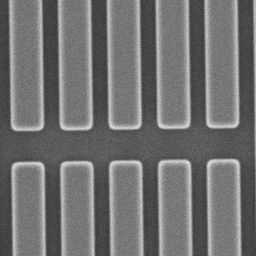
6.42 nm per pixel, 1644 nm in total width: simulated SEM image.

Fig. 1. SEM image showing groups of lines, slits or small figures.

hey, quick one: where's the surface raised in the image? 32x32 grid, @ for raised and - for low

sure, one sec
-@@@@--@@@@--@@@@---@@@@--@@@@--
-@@@@--@@@@--@@@@---@@@@--@@@@--
-@@@@--@@@@---@@@---@@@@--@@@@--
-@@@@--@@@@---@@@---@@@@--@@@@--
-@@@@--@@@@---@@@---@@@@--@@@@--
-@@@@--@@@@---@@@---@@@@--@@@@--
-@@@@--@@@@---@@@@--@@@@--@@@@--
-@@@@--@@@@---@@@@--@@@@--@@@@--
-@@@@---@@@---@@@@--@@@@--@@@@--
-@@@@---@@@---@@@@--@@@@--@@@@--
-@@@@---@@@---@@@@--@@@@--@@@@--
-@@@@---@@@---@@@@--@@@@--@@@@--
-@@@@---@@@---@@@@--@@@@--@@@@--
-@@@@---@@@---@@@@--@@@@--@@@@--
-@@@@---@@@---@@@@--@@@@--@@@@--
-@@@@---@@@---@@@@--@@@@--@@@@--
--------------------------------
--------------------------------
--------------------------------
--------------------------------
--@@@---@@@---@@@---@@@@--@@@@--
--@@@---@@@@--@@@@--@@@@--@@@@--
--@@@---@@@@--@@@@--@@@@--@@@@--
--@@@---@@@@--@@@@--@@@@--@@@@--
--@@@---@@@@--@@@@--@@@@--@@@@--
--@@@---@@@@--@@@@--@@@@--@@@@--
--@@@@--@@@@--@@@@--@@@@--@@@@--
--@@@@--@@@@--@@@@--@@@@--@@@@--
--@@@@--@@@@--@@@@--@@@@--@@@@--
--@@@@--@@@@--@@@@--@@@@--@@@@--
--@@@@--@@@@--@@@@--@@@@--@@@@--
--@@@@--@@@@--@@@@--@@@@--@@@@--